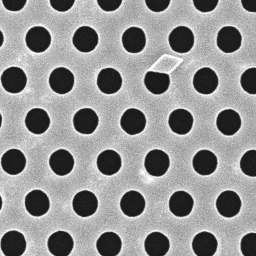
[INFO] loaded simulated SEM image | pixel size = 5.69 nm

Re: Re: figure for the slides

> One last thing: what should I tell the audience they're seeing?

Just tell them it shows a regular array of holes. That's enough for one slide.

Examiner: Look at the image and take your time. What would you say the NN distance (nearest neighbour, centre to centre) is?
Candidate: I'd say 269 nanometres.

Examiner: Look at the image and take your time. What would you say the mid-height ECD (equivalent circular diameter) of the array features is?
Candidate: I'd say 0.149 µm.